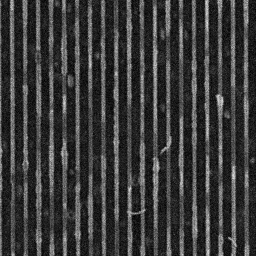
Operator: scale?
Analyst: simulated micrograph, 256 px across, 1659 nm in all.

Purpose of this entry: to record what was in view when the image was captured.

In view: parallel lines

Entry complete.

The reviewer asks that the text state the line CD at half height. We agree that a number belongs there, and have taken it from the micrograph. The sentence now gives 2.99 px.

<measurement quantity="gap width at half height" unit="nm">62.4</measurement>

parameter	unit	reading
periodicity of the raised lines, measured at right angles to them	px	13